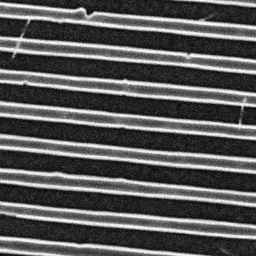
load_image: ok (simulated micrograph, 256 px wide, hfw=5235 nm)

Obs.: parallel lines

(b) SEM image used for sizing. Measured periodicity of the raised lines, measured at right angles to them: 0.677 micrometres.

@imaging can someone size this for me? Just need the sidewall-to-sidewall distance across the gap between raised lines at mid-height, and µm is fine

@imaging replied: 0.425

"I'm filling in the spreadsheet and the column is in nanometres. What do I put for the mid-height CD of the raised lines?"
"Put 265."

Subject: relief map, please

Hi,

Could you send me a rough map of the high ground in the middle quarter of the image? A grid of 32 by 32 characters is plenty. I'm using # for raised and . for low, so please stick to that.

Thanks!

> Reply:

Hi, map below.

................................
................................
................................
##..............................
################................
############################....
....############################
...............#################
.........................#######
................................
................................
##..............................
############....................
#######################.........
..##############################
...........#####################
........................########
................................
................................
................................
#########.......................
##################..............
###############################.
........########################
...................#############
..............................##
................................
................................
#########.......................
#################...............
############################....
.....###########################